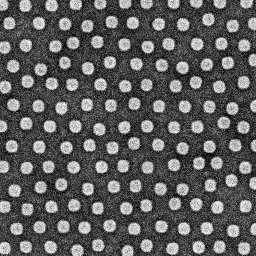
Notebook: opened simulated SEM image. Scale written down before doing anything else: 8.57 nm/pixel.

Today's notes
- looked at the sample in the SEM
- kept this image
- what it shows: a regular array of raised bodies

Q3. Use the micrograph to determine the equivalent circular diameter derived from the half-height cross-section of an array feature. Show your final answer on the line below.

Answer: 98.9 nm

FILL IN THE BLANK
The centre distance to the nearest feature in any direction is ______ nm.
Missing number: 180